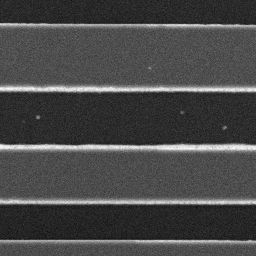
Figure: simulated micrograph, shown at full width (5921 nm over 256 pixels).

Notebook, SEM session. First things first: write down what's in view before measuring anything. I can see lines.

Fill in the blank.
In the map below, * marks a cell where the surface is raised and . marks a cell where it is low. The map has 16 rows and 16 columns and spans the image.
................
................
****************
****************
****************
****************
................
................
................
****************
****************
****************
****************
................
................
****************